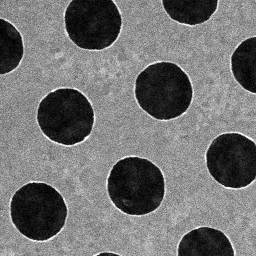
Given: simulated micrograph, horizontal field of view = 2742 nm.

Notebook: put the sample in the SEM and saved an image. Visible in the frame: holes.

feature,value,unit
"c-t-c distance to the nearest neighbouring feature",1060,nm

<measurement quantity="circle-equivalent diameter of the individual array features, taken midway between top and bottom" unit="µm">0.616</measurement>